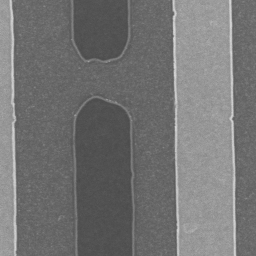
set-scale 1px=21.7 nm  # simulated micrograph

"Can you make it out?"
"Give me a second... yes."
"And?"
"one or a few lines or trenches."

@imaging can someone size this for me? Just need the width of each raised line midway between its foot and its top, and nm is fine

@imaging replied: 1220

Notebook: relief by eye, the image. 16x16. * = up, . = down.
*....***...***..
*....***...***..
*....***...***..
*....**....***..
*..........***..
*..........***..
*....**....***..
*....***...****.
*....***...****.
*....***...****.
*....***...****.
*....***...****.
*....***...****.
*....***...****.
*....***...****.
*....***...****.